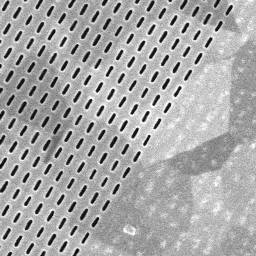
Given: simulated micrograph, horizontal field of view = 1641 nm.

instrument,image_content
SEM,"a regular array of holes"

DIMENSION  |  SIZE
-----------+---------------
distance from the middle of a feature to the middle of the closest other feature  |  13.5 px